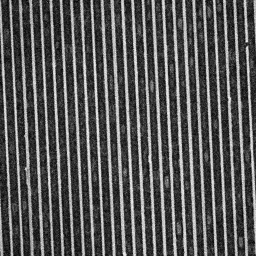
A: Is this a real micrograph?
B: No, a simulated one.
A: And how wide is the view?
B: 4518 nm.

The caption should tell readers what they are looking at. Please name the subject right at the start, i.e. parallel lines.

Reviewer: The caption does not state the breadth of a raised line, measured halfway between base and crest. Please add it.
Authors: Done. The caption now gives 46.3 nm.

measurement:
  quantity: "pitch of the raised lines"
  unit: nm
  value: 180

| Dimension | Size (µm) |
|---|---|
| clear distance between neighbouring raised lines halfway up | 0.139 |